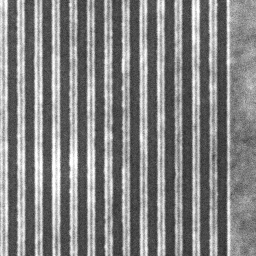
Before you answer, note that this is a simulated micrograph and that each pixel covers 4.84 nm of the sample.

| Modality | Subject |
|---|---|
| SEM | parallel lines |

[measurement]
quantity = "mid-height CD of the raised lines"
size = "27.2 nanometres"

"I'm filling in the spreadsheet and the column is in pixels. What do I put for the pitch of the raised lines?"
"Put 17.5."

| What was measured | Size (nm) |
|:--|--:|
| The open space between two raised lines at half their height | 54.4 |